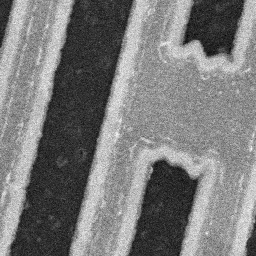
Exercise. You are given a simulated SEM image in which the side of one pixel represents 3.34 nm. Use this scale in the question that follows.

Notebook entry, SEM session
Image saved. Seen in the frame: one or a few lines or trenches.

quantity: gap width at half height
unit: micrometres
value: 0.244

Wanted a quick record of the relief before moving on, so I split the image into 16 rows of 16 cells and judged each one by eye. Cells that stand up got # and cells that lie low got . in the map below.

.###.....##.....
.###.....##....#
.###....###....#
.##.....#####..#
###.....########
###.....########
###....#########
##.....#########
##.....#########
##.....#########
#.....###...####
#.....###....###
#.....##.....###
#.....##....###.
#....###....###.
.....###....###.